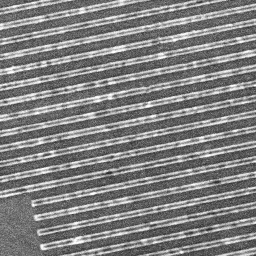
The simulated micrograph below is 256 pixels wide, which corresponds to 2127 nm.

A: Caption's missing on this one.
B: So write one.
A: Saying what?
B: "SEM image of parallel lines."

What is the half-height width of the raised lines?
40.8 nm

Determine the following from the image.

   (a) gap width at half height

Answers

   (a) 0.0826 microns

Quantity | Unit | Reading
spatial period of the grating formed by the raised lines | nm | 124